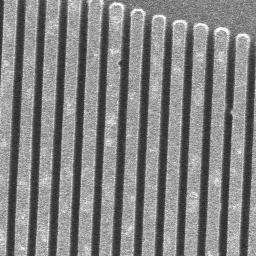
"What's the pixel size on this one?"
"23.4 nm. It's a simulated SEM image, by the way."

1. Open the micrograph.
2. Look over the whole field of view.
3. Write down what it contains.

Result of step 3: parallel lines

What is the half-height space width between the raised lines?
7.99 pixels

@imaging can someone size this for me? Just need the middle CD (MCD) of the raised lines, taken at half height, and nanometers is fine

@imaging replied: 304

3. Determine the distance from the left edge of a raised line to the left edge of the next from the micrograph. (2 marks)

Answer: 497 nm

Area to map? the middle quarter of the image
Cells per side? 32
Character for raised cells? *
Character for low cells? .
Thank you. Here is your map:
***...***..***..***..****..***..
***...***..***..***..****..***..
***..****..***..***..****..***..
***..****..***..***..****..***..
***..***...***..***..***...***..
***..***...***..***..***..****..
***..***...***..***..***..****..
***..****.****..***..***...***..
***..***..****..***..***...***..
***..***..****..***..***...***..
***..***..****..***..***..****..
***..***..****..***..***..***...
***..***..****..***..***..***...
***..***..***...***..***..***...
***..***..***...***..***..***...
***..***..***...***..***..***..*
***..***..***...***..***..***..*
***..***..***..****..***..***..*
***..***..***..***...***..***..*
***..***..***..***...***..***..*
**...***..***..***...***..***..*
**...***..***..***...***..***..*
**...***..***..***..****..***..*
**...***..***..***..****..***..*
**...***..***..***..****..***..*
**..****..***..***..****..***..*
**..****..***..***..****..***..*
**..****..***..***..****..***..*
**..****..***..***..***...***..*
**..****.****..***..***...***..*
**..***..****..***..***...***..*
**..***..****..***..***...***..*